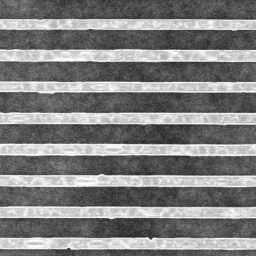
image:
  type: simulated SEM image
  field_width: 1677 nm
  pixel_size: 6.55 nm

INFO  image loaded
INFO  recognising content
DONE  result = parallel lines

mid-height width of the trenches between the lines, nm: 139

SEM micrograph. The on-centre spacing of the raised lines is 0.205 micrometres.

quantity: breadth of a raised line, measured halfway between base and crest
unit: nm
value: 69.6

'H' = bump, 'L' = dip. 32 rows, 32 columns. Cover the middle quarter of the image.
LLLLLLLLLLLLLLLLLLLLLLLLLLLLLLLL
LLLLLLLLLLLLLLLLLLLLLLLLLLLLLLLL
LLLLLLLLLLLLLLLLLLLLLLLLLLLLLLLL
LLLLLLLLLLLLLLLLLLLLLLLLLLLLLLLL
LLLLLLLLLLLLLLLLLLLLLLLLLLLLLLLL
HHHHHHHHHHHHHHHHHHHHHHHHHHHHHHHH
HHHHHHHHHHHHHHHHHHHHHHHHHHHHHHHH
LLLLLLLLLLLLLLLLLLLLLLLLLLLLLLLL
LLLLLLLLLLLLLLLLLLLLLLLLLLLLLLLL
LLLLLLLLLLLLLLLLLLLLLLLLLLLLLLLL
LLLLLLLLLLLLLLLLLLLLLLLLLLLLLLLL
LLLLLLLLLLLLLLLLLLLLLLLLLLLLLLLL
HHHHHHHHHHHLLLLLLLLLLLLLLLLLLLLL
HHHHHHHHHHHHHHHHHHHHHHHHHHHHHHHH
HHHHHHHHHHHHHHHHHHHHHHHHHHHHHHHH
LLLLLLLLLLLLLLLLLLLLLLLLLLLLLLLL
LLLLLLLLLLLLLLLLLLLLLLLLLLLLLLLL
LLLLLLLLLLLLLLLLLLLLLLLLLLLLLLLL
LLLLLLLLLLLLLLLLLLLLLLLLLLLLLLLL
LLLLLLLLLLLLLLLLLLLLLLLLLLLLLLLL
HHHHHHHHHHHHHHHHHHHHHHHHHHHHHHHH
HHHHHHHHHHHHHHHHHHHHHHHHHHHHHHHH
HHHHHHHHHHHHHHHHHHHHHHHHHHHHHHHH
LLLLLLLLLLLLLLLLLLLLLLLLLLLLLLLL
LLLLLLLLLLLLLLLLLLLLLLLLLLLLLLLL
LLLLLLLLLLLLLLLLLLLLLLLLLLLLLLLL
LLLLLLLLLLLLLLLLLLLLLLLLLLLLLLLL
LLLLLLLLLLLLLLLLLLLLLLLLLLLLLLLL
HHHHHHHHHHHHHHHHHHHHHHHHHHHHHHHH
HHHHHHHHHHHHHHHHHHHHHHHHHHHHHHHH
LLLLLLLLLLLLLLLLLLLLLLLLLLLLLLLL
LLLLLLLLLLLLLLLLLLLLLLLLLLLLLLLL